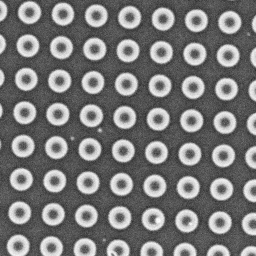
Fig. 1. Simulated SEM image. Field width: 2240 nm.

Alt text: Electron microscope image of an array of small figures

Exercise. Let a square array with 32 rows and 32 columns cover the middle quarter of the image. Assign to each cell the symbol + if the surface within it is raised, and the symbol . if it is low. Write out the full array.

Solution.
................................
................................
+.....+++......+................
++...+++++...+++++....++++.....+
++...+++++...+++++....++++....++
+....+++++...+++++...++++++...++
.....++++....+++++....++++....++
..............+++.....++++....++
................................
................................
......++........................
+....++++....++++.....+++.......
+...++++++...+++++...+++++....++
+...+++++....+++++...+++++...+++
.....++++....+++++...+++++...+++
......++......+++.....++++....++
...............................+
................................
................................
....++++.....+++................
+...+++++...+++++....++++.....++
+...+++++...+++++....+++++...+++
....+++++...+++++....+++++...+++
.....+++.....++++....++++....+++
......................++......++
................................
................................
.....+++........................
....++++....+++++....+++......++
...++++++...+++++...+++++....+++
....+++++...+++++...+++++....+++
....++++....+++++...+++++...++++